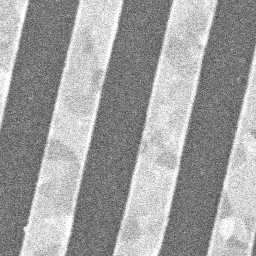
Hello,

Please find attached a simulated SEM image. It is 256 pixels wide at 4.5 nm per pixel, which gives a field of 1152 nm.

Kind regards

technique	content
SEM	one or a few lines or trenches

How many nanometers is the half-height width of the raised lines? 182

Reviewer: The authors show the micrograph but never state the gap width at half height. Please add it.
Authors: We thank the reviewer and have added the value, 231 nm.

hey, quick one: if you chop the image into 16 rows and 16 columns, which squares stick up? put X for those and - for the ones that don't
XX---XXX---XX---
X----XX----XX---
X---XXX---XXX---
X---XXX---XXX---
X---XXX---XX----
----XX----XX---X
----XX---XXX---X
---XXX---XXX---X
---XXX---XX----X
---XX----XX----X
---XX----XX---XX
--XXX---XXX---XX
--XXX---XXX---XX
--XXX---XX----XX
--XX---XXX---XXX
-XXX---XXX---XXX